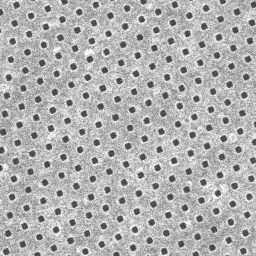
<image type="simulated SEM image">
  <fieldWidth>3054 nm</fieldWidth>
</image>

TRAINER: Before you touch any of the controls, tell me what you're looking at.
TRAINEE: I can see a regular array of holes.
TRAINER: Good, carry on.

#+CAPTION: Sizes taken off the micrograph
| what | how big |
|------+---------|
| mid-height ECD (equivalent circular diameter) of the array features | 85.2 nm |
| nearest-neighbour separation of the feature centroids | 215 nm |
